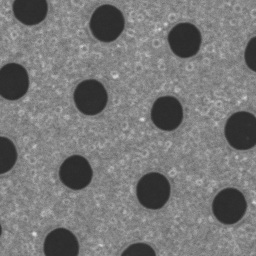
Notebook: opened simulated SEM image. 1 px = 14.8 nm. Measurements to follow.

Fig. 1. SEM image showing holes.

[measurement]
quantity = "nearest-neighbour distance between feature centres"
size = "1120 nanometres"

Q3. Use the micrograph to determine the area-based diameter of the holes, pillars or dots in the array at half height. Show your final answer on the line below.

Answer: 519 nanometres